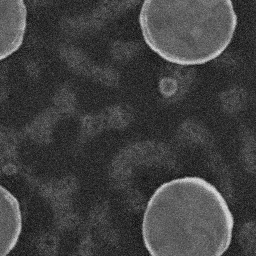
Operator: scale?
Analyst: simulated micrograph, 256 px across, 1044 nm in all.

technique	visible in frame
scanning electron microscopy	raised bodies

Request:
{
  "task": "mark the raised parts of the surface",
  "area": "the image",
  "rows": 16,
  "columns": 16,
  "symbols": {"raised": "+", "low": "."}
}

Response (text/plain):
++.......+++++..
++.......++++++.
+........+++++..
..........+++...
................
................
................
................
................
................
................
..........+++...
+........+++++..
+........+++++..
+........+++++..
+........+++++..